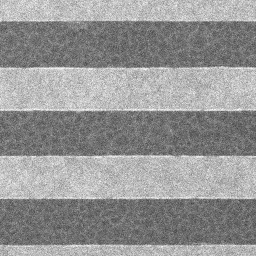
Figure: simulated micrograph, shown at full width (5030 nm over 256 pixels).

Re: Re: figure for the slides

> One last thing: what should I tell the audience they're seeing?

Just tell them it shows one or a few lines or trenches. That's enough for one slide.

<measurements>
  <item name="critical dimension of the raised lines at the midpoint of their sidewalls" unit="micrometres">0.823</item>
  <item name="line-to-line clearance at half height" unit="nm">931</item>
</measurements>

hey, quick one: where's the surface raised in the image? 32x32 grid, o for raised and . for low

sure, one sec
oooooooooooooooooooooooooooooooo
oooooooooooooooooooooooooooooooo
oooooooooooooooooooooooooooooooo
................................
........................oo......
.o..o...................oo......
................................
................................
....................oo....oo....
oooooooooooooooooooooooooooooooo
oooooooooooooooooooooooooooooooo
oooooooooooooooooooooooooooooooo
oooooooooooooooooooooooooooooooo
oooooooooooooooooooooooooooooooo
..............o.................
.....o..........................
....................o...........
............o..o................
................................
................................
oooooooooooooooooooooooooooooooo
oooooooooooooooooooooooooooooooo
oooooooooooooooooooooooooooooooo
oooooooooooooooooooooooooooooooo
oooooooooooooooooooooooooooooooo
................................
................................
................................
................................
........................o.......
........................oo......
oooooooooooooooooooooooooooooooo